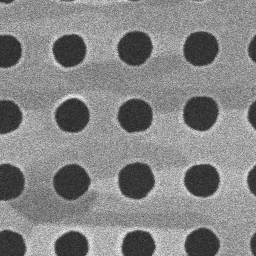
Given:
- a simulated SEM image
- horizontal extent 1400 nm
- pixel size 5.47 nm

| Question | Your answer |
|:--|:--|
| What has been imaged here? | a regular array of holes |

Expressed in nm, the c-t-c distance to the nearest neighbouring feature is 355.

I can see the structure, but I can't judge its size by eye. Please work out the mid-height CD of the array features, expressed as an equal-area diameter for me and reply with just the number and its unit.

195 nm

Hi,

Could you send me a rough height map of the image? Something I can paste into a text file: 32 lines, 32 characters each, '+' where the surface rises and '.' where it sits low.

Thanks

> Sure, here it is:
++++++++++++++++++++++++++++++++
++++++++++++++++++++++++++++++++
++++++++++++++++++++++++++++++++
++++++++++++++++++++++++++++++++
..++++++..+++++....+++++...+++++
...++++....++++....++++....++++.
...++++....++++....++++....++++.
..+++++...+++++...+++++....++++.
++++++++++++++++++++++++++++++++
++++++++++++++++++++++++++++++++
++++++++++++++++++++++++++++++++
++++++++++++++++++++++++++++++++
.+++++++..++++++..++++++...+++++
..+++++....++++....++++....++++.
...++++....++++....++++....++++.
...++++....++++....++++....++++.
.+++++++..++++++.+++++++++++++++
++++++++++++++++++++++++++++++++
++++++++++++++++++++++++++++++++
++++++++++++++++++++++++++++++++
.+++++++++++++++..+++++++.++++++
...++++....++++....++++....++++.
...++++....++++....++++.....+++.
...++++....++++....++++....++++.
..+++++...++++++..++++++..++++++
++++++++++++++++++++++++++++++++
++++++++++++++++++++++++++++++++
++++++++++++++++++++++++++++++++
+++++++++++++++++++++++++.++++++
...+++++...+++++...++++....+++++
...++++....++++....++++.....+++.
...++++....++++....++++....++++.